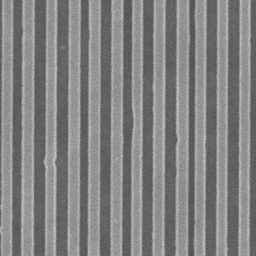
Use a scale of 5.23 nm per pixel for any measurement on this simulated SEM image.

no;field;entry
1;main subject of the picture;parallel lines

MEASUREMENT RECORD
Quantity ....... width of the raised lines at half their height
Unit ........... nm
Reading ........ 50.4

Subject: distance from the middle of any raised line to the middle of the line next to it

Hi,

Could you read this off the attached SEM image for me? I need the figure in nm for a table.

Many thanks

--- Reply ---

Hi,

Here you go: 113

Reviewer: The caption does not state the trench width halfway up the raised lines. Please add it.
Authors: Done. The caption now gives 0.0635 µm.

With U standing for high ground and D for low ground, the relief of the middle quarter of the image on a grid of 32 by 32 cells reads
DUUUDDUUUDDDUUDDDUUDDDDUUDDDDUUD
DUUUDDUUUDDDUUDDDUUDDDDUUDDDDUUD
DUUUDDUUUDDDUUUDDUUDDDDUUDDDDUUD
DUUUDDUUUDDDUUDDDUUDDDDUUDDDDUUD
DUUUDDUUUDDDUUDDDUUDDDDUUDDDUUUD
DUUUDDUUUDDDUUDDDUUDDDDUUDDDUUUD
DUUUDDUUUDDDUUDDDUUDDDDUUDDDDUUD
DUUUDDUUUDDDUUDDDUUDDDDUUDDDDUUD
DUUUDDUUUDDDUUDDDUUDDDDUUDDDDUUD
DUUUDDUUUDDDUUDDDUUDDDDUUDDDUUUD
DUUUDDUUUDDDUUDDDUUDDDDUUDDDUUUD
DUUUDDUUUDDDUUDDDUUDDDDUUDDDDUUD
DUUUDDUUUDDDUUDDDUUDDDDUUDDDDUUD
DUUUDDUUUDDDUUDDDDUDDDDUUDDDUUUD
DUUUDDUUUDDDUUDDDDUDDDDUUDDDUUUD
DUUUDDUUUDDDUUDDDDUDDDDUUDDDUUUD
DUUUDDUUUDDDUUDDDUUDDDDUUDDDUUUD
DUUUDDUUUDDDUUDDDUUDDDDUUDDDUUUD
DUUUDDUUUDDDUUUDDUUDDDDUUDDDDUUD
DUUUDDUUUDDDUUUDDUUDDDDUUDDDUUUD
DUUUDDUUUDDDUUDDDUUDDDDUUDDDUUUD
DUUUDDUUUDDDUUDDDUUDDDDUUDDDUUUD
DUUUDDUUUDDDUUUDDUUDDDDUUDDDUUUD
DUUUDDUUUDDDUUUDDUUDDDDUUDDDUUUD
DUUUDDUUUDDDUUDDDUUDDDDUUDDDUUUD
DUUUDDDUUDDDUUDDDUUDDDDUUDDDUUUD
DUUUDDUUUDDDUUDDDUUDDDDUUDDDUUUD
DUUUDDUUUDDDUUDDDUUDDDDUUDDDUUUD
DUUUDDUUUDDDUUDDDUUDDDDUUDDDUUUD
DUUUDDUUUDDDUUDDDUUDDDDUUDDDUUUD
DUUUDDUUUDDDUUDDDUUDDDDUUDDDUUUD
DUUUDDUUUDDDUUDDDUUDDDDUUDDDUUUD